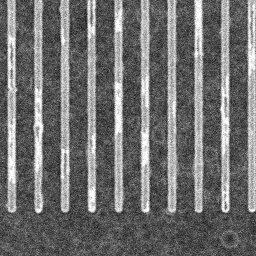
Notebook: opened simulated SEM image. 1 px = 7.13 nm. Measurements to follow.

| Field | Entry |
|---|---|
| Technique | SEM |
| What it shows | parallel lines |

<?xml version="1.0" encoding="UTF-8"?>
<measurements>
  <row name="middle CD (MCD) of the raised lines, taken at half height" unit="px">7.12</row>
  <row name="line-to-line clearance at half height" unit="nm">141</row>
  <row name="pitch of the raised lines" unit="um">0.19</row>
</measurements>